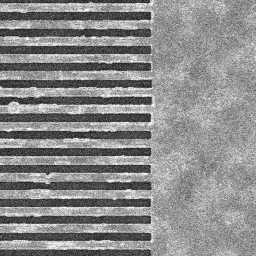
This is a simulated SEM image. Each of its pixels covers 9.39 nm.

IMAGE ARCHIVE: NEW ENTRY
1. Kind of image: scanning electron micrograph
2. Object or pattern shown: parallel lines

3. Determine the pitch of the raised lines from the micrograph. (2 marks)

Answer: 159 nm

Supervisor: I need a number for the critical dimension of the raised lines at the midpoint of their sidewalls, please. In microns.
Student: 0.0751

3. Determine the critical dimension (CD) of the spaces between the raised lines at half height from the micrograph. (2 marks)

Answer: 82.2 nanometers